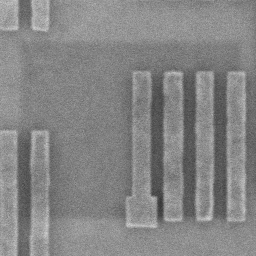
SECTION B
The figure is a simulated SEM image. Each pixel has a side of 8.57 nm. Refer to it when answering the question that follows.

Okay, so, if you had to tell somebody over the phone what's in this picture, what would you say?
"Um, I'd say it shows wiring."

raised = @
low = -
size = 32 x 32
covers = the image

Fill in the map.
@@--@@--------------------------
@@--@@--------------------------
@@--@@--------------------------
@@--@@--------------------------
--------------------------------
--------------------------------
--------------------------------
--------------------------------
--------------------------------
-----------------@@--@@--@@-@@@-
-----------------@@--@@--@@-@@@-
-----------------@@--@@--@@-@@@-
-----------------@@--@@--@@-@@@-
-----------------@@--@@--@@-@@@-
-----------------@@--@@--@@-@@@-
-----------------@@--@@--@@-@@@-
@@--@@-----------@@--@@--@@-@@@-
@@--@@-----------@@--@@--@@-@@@-
@@--@@-----------@@--@@--@@-@@@-
@@--@@-----------@@--@@--@@-@@@-
@@--@@-----------@@--@@--@@-@@@-
@@--@@-----------@@--@@--@@-@@@-
@@--@@-----------@@--@@--@@-@@@-
@@--@@-----------@@-@@@--@@-@@@-
@@--@@----------@@@--@@--@@-@@@-
@@--@@----------@@@@-@@--@@-@@@-
@@--@@----------@@@@-@@--@@-@@@-
@@--@@----------@@@@-@---@---@--
@@--@@--------------------------
@@--@@--------------------------
@@--@@--------------------------
@@--@@--------------------------